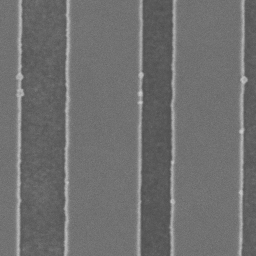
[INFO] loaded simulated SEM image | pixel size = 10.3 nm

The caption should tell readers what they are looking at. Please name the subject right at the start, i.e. lines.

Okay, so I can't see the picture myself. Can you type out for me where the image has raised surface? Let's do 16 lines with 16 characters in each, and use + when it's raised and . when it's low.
+...+++++..++++.
+...+++++..++++.
+...+++++..++++.
+...+++++..++++.
+...+++++..++++.
+...+++++..++++.
+...+++++..++++.
+...+++++..++++.
+...+++++..++++.
+...+++++..++++.
+...+++++..++++.
+...+++++..++++.
+...+++++..++++.
+...+++++..++++.
+...+++++..++++.
+...+++++..++++.